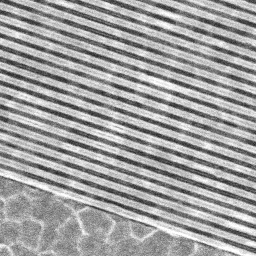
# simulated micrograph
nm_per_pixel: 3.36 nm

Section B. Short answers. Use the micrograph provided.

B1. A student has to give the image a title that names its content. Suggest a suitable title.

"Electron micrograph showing parallel lines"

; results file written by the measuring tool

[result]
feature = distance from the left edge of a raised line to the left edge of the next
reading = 37.7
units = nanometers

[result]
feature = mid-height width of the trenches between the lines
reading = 17.9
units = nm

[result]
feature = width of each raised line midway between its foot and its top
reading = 0.0207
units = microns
